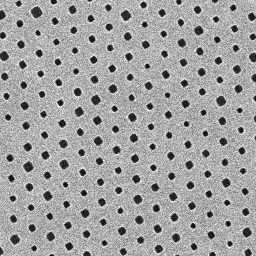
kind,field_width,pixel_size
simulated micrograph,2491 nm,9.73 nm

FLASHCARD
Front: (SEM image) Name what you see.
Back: a regular array of holes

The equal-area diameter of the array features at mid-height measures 0.072 micrometres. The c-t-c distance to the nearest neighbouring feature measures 20 pixels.